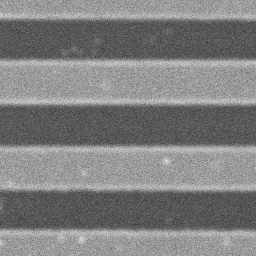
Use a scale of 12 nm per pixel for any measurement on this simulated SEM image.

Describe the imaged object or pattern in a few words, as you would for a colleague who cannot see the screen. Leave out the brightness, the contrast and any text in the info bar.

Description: lines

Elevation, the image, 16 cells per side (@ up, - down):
@@@@@@@@@@@@@@@@
----------------
----------------
----------------
@@@@@@@@@@@@@@@@
@@@@@@@@@@@@@@@@
----------------
----------------
----------------
@@@@@@@@@@@@@@@@
@@@@@@@@@@@@@@@@
@@@@@@@@@@@@@@@@
----------------
----------------
@@@@@@@@@@@@-@@@
@@@@@@@@@@@@@@@@